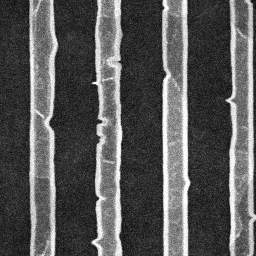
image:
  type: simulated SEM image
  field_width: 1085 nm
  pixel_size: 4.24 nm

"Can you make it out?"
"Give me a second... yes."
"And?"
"one or a few lines or trenches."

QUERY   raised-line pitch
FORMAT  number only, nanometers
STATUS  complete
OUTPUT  282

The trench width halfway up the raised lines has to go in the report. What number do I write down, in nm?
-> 200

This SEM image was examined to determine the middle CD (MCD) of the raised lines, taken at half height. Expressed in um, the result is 0.0837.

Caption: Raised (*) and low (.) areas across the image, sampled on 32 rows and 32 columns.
....**......***......**......**.
....**......***......**......**.
....**......***......**......**.
....**......***......**......**.
....***.....***......**......**.
....***.....***......**......**.
....***.....***......**......**.
....**......**.......**......**.
....**......***......**......**.
....**......***......**......**.
....***.....***......**......**.
....***......**......**......**.
....**.......**......**......**.
....**.......**......**......**.
....**.......**......**......**.
....**.......**......**......**.
....**.......**......**......**.
....***......**......**......**.
....**......***......**......**.
....**......***......**......**.
....**......***......**......**.
....***.....***......**......**.
....***.....***......**......**.
....***.....***......**......**.
....***.....***......**......**.
....***.....***......**......**.
....***.....***......**......**.
....***.....***......**......***
....***.....***......**......**.
....***......**......**......**.
....***.....***......**......**.
....***......**......**......**.